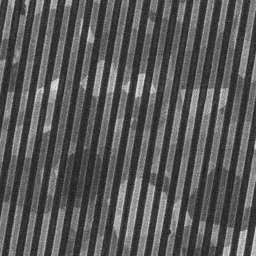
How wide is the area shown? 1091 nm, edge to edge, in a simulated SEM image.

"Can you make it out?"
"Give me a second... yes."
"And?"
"parallel lines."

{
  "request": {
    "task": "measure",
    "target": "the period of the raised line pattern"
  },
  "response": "59.8 nm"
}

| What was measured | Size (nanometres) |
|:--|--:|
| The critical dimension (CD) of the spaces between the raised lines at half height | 34.1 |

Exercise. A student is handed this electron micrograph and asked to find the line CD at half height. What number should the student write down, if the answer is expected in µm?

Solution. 0.0267